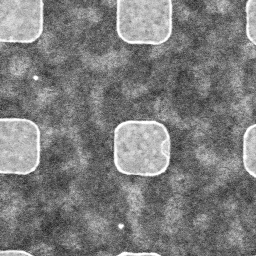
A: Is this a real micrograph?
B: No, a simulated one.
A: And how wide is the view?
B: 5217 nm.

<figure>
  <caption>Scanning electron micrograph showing raised bodies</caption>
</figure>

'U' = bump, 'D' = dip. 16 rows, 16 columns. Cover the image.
UUUDDDDUUUUDDDDU
UUUDDDDUUUUDDDDU
UUDDDDDDUUDDDDDD
DDDDDDDDDDDDDDDD
DDDDDDDDDDDDDDDD
DDDDDDDDDDDDDDDD
DDDDDDDDDDDDDDDD
UDDDDDDDDDDDDDDD
UUDDDDDUUUDDDDDU
UUDDDDDUUUDDDDDU
UUDDDDDDUUDDDDDU
DDDDDDDDDDDDDDDD
DDDDDDDDDDDDDDDD
DDDDDDDDDDDDDDDD
DDDDDDDDDDDDDDDD
DDDDDDDDDDDDDDDD